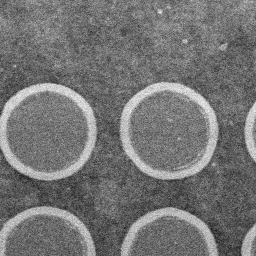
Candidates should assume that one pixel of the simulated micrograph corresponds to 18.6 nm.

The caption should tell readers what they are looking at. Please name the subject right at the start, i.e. raised bodies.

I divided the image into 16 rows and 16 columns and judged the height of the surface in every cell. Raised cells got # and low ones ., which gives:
................
................
................
................
................
..........#.....
.####...#####...
######..#####...
######..#####...
#####...#####...
.####....###....
................
................
.###......##....
#####...#####...
######..#####..#